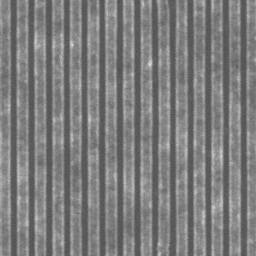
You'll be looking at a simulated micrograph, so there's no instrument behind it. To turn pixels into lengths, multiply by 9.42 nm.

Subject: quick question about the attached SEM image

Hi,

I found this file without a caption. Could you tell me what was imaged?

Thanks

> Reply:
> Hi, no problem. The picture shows parallel lines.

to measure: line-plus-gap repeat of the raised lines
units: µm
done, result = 0.167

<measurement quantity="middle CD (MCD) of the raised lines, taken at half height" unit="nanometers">88.3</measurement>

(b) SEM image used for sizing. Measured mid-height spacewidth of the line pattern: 71.8 nanometres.